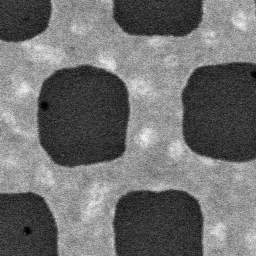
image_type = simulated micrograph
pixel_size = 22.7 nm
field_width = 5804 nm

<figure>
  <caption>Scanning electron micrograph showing holes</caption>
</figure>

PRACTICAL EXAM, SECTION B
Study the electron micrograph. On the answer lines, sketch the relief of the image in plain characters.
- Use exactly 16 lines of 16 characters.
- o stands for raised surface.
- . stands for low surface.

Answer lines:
...oooo......ooo
...oooo.....oooo
..oooooooooooooo
oooooooooooooooo
ooo....ooooo....
ooo.....ooo.....
oo......ooo.....
oo......ooo.....
oo......ooo.....
ooo.....oooo....
oooooooooooooooo
oooooooooooooooo
...oooo.....oooo
...oooo......ooo
....ooo......ooo
....ooo......ooo